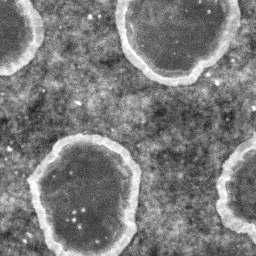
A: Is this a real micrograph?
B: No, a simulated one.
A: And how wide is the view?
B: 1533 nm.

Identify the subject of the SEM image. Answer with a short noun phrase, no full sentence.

raised bodies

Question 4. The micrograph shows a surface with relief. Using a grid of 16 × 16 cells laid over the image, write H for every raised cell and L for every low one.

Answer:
HHLLLLLLHHHHHHHL
HHLLLLLLHHHHHHLL
HHLLLLLLHHHHHHLL
HHLLLLLLHHHHHLLL
LLLLLLLLLHHHLLLL
LLLLLLLLLLLLLLLL
LLLLLLLLLLLLLLLL
LLLLLLLLLLLLLLLL
LLLLLLLLLLLLLLLL
LLLHHHHHLLLLLLLH
LLLHHHHHLLLLLLHH
LLHHHHHHLLLLLLHH
LLHHHHHHLLLLLLHH
LLLHHHHHLLLLLLHH
LLLHHHHHLLLLLLLL
LLLLHHHLLLLLLLLL